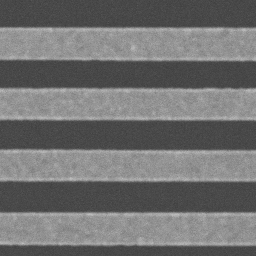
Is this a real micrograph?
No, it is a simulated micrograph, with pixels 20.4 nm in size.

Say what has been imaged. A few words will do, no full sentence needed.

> lines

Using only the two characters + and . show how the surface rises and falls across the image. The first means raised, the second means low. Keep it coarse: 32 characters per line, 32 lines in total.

................................
................................
................................
................................
++++++++++++++++++++++++++++++++
++++++++++++++++++++++++++++++++
++++++++++++++++++++++++++++++++
..............++++.+++++++++++++
................................
................................
................................
++++++++++++++++++++++++++++++++
++++++++++++++++++++++++++++++++
++++++++++++++++++++++++++++++++
++++++++++++++++++++++++++++++++
................................
................................
................................
................................
++++++++++++++++++++++++++++++++
++++++++++++++++++++++++++++++++
++++++++++++++++++++++++++++++++
++++++++++++++++++++++++++++++++
................................
................................
................................
................................
++++++++++++++++++++++++++++++++
++++++++++++++++++++++++++++++++
++++++++++++++++++++++++++++++++
++++++++++++++++++++++++++++++++
................................